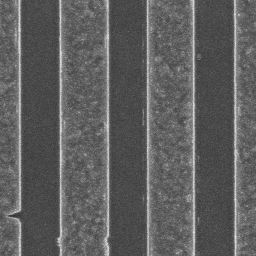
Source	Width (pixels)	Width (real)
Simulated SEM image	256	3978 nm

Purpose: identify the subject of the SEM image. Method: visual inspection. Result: one or a few lines or trenches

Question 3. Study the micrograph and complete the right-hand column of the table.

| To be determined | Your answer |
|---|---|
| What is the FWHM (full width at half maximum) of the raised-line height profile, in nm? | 727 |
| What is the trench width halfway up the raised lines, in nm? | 622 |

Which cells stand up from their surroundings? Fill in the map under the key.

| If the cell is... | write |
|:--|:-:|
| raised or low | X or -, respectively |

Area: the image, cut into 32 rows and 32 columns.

XX------XXXXX------XXXXX-----XXX
XX------XXXXX------XXXXX-----XXX
XX------XXXXX------XXXXX-----XXX
XX------XXXXX------XXXXX-----XXX
XX------XXXXXX-----XXXXX-----XXX
XX------XXXXX------XXXXX-----XXX
XX------XXXXX------XXXXX-----XXX
XX------XXXXX------XXXXX-----XXX
XX------XXXXX------XXXXX-----XXX
XX------XXXXX------XXXXX-----XXX
XX------XXXXX------XXXXX-----XXX
XX------XXXXX------XXXXX-----XXX
XX------XXXXX------XXXXX-----XXX
XX------XXXXX------XXXXX-----XXX
XX------XXXXX------XXXXX-----XXX
XX------XXXXX------XXXXX-----XXX
XX------XXXXX------XXXXX-----XXX
XX------XXXXX------XXXXX-----XXX
XX------XXXXX------XXXXX-----XXX
XX------XXXXX------XXXXX-----XXX
XX------XXXXX------XXXXX-----XXX
XX------XXXXX------XXXXX-----XXX
XX------XXXXX------XXXXX-----XXX
XX------XXXXX------XXXXX------XX
XX------XXXXX------XXXXX------XX
XX------XXXXX------XXXXX-----XXX
XX------XXXXX------XXXXX------XX
XX------XXXXX------XXXXX-----XXX
XX------XXXXX------XXXXX------XX
XX-----XXXXXX------XXXXX-----XXX
XX-----XXXXXX------XXXXX------XX
XX------XXXXX------XXXXX-----XXX